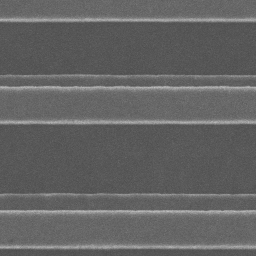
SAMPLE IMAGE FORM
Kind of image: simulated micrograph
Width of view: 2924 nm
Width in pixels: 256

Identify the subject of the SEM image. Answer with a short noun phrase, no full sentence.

lines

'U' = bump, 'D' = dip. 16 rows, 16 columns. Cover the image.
UUUUUUUUUUUUUUUU
DDDDDDDDDDDDDDDD
DDDDDDDDDDDDDDDD
DDDDDDDDDDDDDDDD
DDDDDDDDDDDDDDDD
UUUUUUUUUUUUUUUU
UUUUUUUUUUUUUUUU
UUUUUUUUUUUUUUUU
DDDDDDDDDDDDDDDD
DDDDDDDDDDDDDDDD
DDDDDDDDDDDDDDDD
DDDDDDDDDDDDDDDD
UUUUUUUUUUUUUUUU
UUUUUUUUUUUUUUUU
UUUUUUUUUUUUUUUU
DDDDDDDDDDDDDDDD